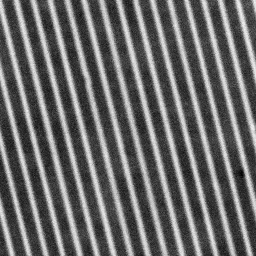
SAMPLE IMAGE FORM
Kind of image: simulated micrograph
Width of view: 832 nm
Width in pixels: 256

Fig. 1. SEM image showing parallel lines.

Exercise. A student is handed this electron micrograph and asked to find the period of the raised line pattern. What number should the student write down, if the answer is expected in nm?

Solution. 53.6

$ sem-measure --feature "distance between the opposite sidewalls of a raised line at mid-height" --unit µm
0.0111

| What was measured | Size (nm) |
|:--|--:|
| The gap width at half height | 41.3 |